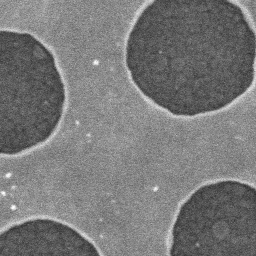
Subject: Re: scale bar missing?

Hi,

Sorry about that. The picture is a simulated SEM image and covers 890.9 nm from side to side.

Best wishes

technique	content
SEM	holes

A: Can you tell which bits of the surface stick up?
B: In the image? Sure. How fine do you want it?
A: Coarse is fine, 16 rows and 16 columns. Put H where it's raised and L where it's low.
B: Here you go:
HHHHHHHHHLLLLLLH
HHHHHHHHLLLLLLLL
LLHHHHHHLLLLLLLL
LLLHHHHHLLLLLLLL
LLLLHHHHLLLLLLLL
LLLLHHHHHLLLLLLH
LLLLHHHHHHLLLLHH
LLLLHHHHHHHHHHHH
LLLHHHHHHHHHHHHH
LHHHHHHHHHHHHHHH
HHHHHHHHHHHHHHHH
HHHHHHHHHHHHHLLH
HHHHHHHHHHHHLLLL
HHHHHHHHHHHLLLLL
LLLLLHHHHHHLLLLL
LLLLLLHHHHHLLLLL